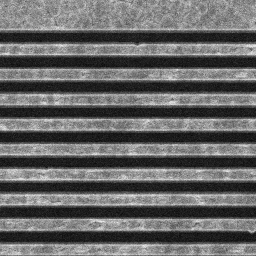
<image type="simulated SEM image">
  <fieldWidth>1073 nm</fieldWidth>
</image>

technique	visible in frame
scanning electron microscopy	parallel lines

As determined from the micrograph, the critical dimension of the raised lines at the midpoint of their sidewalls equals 54.4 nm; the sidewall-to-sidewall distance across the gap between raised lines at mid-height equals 50.2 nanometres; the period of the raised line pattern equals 105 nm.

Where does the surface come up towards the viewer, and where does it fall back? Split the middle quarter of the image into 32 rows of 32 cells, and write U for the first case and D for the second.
DDDDDDDDDDDDDDDDDDDDDDDDDDDDDDDD
UUUUUUUUUUUUUUUUUUUUUUUUUUUUUUUU
UUUUUUUUUUUUUUUUUUUUUUUUUUUUUUUU
UUUUUUUUUUUUUUUUUUUUUUUUUUUUUUUU
DDDDDDDDDDDDDDDDDDDDDDDDDDDDDDDD
DDDDDDDDDDDDDDDDDDDDDDDDDDDDDDDD
DDDDDDDDDDDDDDDDDDDDDDDDDDDDDDDD
UUUUUUUUUUUUUUUUUUUUUUUUUUUUUUUU
UUUUUUUUUUUUUUUUUUUUUUUUUUUUUUUU
UUUUUUUUUUUUUUUUUUUUUUUUUUUUUUUU
DDDDDDDDDDDDDDDDDDDDDDDDDDDDDDDD
DDDDDDDDDDDDDDDDDDDDDDDDDDDDDDDD
DDDDDDDDDDDDDDDDDDDDDDDDDDDDDDDD
DDDDDDDDDDDDDDDDDDDDDDDDDDDDDDDD
UUUUUUUUUUUUUUUUUUUUUUUUUUUUUUUU
UUUUUUUUUUUUUUUUUUUUUUUUUUUUUUUU
UUUUUUUUUUUUUUUUUUUUUUUUUUUUUUUU
DDDDDDDDDDDDDDDDDDDDDDDDDDDDDDDD
DDDDDDDDDDDDDDDDDDDDDDDDDDDDDDDD
DDDDDDDDDDDDDDDDDDDDDDDDDDDDDDDD
UUUUUUUUUUUUUUUUUUUUUUUUUUUUUUUU
UUUUUUUUUUUUUUUUUUUUUUUUUUUUUUUU
UUUUUUUUUUUUUUUUUUUUUUUUUUUUUUUU
DDDDDDDDDDDDDDDDDDDDDDDDDDDDDDDD
DDDDDDDDDDDDDDDDDDDDDDDDDDDDDDDD
DDDDDDDDDDDDDDDDDDDDDDDDDDDDDDDD
UUUUUUUUUUUUUUUUUUUUUUUUUUUUUUUU
UUUUUUUUUUUUUUUUUUUUUUUUUUUUUUUU
UUUUUUUUUUUUUUUUUUUUUUUUUUUUUUUU
DDDDDDDDDDDDDDDDDDDDDDDDDDDDDDDD
DDDDDDDDDDDDDDDDDDDDDDDDDDDDDDDD
DDDDDDDDDDDDDDDDDDDDDDDDDDDDDDDD